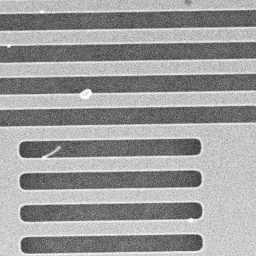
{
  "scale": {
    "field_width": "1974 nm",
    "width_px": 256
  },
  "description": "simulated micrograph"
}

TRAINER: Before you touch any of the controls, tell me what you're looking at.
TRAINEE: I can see groups of lines, slits or small figures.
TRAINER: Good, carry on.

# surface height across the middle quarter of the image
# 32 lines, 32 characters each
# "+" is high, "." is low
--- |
++++++++++++++++++++++++++++++++
++++++++++++++++++++++++++++++++
++++++++++++++++++++++++++++++++
................................
................................
................................
.....+..........................
....++++++++++++++++++++++++++++
++++++++++++++++++++++++++++++++
++++++++++++++++++++++++++++++++
++++++++++++++++++++++++++++....
................................
................................
................................
................................
...........+++++++++++++++++++++
++++++++++++++++++++++++++++++++
++++++++++++++++++++++++++++++++
++++++++++++++++++++++++++++++++
................................
................................
................................
................................
.....+++++++++++++++++++++++++++
++++++++++++++++++++++++++++++++
++++++++++++++++++++++++++++++++
++++++++++++++++++++++++++++....
................................
................................
................................
................................
++++++++++++++++++++++++++++++++